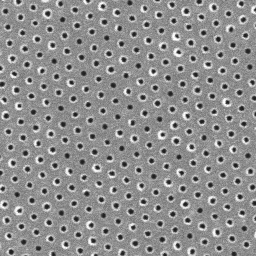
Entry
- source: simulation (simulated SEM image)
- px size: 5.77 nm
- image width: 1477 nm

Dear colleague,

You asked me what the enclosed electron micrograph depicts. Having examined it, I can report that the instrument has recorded a regular array of holes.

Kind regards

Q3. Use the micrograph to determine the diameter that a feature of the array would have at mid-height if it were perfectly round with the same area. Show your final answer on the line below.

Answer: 31.2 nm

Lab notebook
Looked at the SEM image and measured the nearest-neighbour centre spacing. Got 89.8 nanometres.